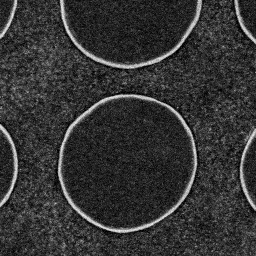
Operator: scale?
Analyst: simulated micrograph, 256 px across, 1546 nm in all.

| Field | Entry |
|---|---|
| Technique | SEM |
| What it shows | raised bodies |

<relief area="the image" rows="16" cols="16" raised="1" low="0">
1000111111110001
1000111111110001
0000011111100000
0000001111000000
0000000000000000
0000000000000000
0000001111000000
0000011111100000
0000111111110000
1000111111110001
1000111111110001
1000111111110001
0000111111100000
0000011111000000
0000000000000000
0000000000000000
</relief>